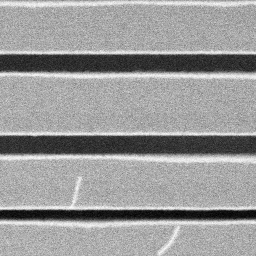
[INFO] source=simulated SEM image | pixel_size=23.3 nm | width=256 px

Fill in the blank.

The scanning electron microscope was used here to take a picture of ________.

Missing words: lines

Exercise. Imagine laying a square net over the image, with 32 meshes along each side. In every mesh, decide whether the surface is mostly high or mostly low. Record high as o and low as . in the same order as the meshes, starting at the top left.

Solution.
oooooooooooooooooooooooooooooooo
oooooooooooooooooooooooooooooooo
oooooooooooooooooooooooooooooooo
oooooooooooooooooooooooooooooooo
oooooooooooooooooooooooooooooooo
oooooooooooooooooooooooooooooooo
oooooooooooooooooooooooooooooooo
................................
................................
oooooooooooooooooooooooooooooooo
oooooooooooooooooooooooooooooooo
oooooooooooooooooooooooooooooooo
oooooooooooooooooooooooooooooooo
oooooooooooooooooooooooooooooooo
oooooooooooooooooooooooooooooooo
oooooooooooooooooooooooooooooooo
oooooooooooooooooooooooooooooooo
................................
................................
ooooooooooooooooooooo...........
oooooooooooooooooooooooooooooooo
oooooooooooooooooooooooooooooooo
oooooooooooooooooooooooooooooooo
oooooooooooooooooooooooooooooooo
oooooooooooooooooooooooooooooooo
oooooooooooooooooooooooooooooooo
................................
.....................o.......ooo
oooooooooooooooooooooooooooooooo
oooooooooooooooooooooooooooooooo
oooooooooooooooooooooooooooooooo
oooooooooooooooooooooooooooooooo